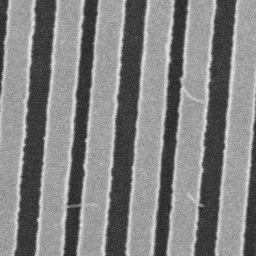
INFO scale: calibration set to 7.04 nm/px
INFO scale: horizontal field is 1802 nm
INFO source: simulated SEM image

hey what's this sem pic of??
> lines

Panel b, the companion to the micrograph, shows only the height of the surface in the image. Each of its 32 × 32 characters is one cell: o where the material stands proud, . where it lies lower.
.ooo...ooo..oooo..oooo..ooo...oo
.ooo...ooo..oooo..oooo..ooo..ooo
.ooo...ooo..oooo..oooo.oooo..ooo
.ooo...ooo..ooo...ooo..oooo..ooo
.ooo...ooo..ooo...ooo..oooo..ooo
.ooo...ooo..ooo...ooo..ooo...ooo
.ooo...ooo..ooo...ooo..ooo...ooo
.ooo...ooo..ooo...ooo..ooo...ooo
oooo...ooo..ooo...ooo..ooo...ooo
oooo..oooo..ooo...ooo..ooo...ooo
oooo..oooo.oooo...ooo..ooo...ooo
oooo..oooo.oooo..oooo..ooo...ooo
ooo...ooo..oooo..oooo..ooo...ooo
ooo...ooo..oooo..oooo.oooo..oooo
ooo...ooo..ooo...oooo.oooo..oooo
ooo...ooo..ooo...oooo.oooo..oooo
ooo...ooo..ooo...ooo..oooo..oooo
ooo...ooo..ooo...ooo..ooo...oooo
ooo...ooo..ooo...ooo..ooo...ooo.
ooo..oooo..ooo...ooo..ooo...ooo.
ooo..oooo..ooo...ooo..ooo...ooo.
ooo..oooo..ooo...ooo..ooo...ooo.
ooo..oooo.oooo...ooo..ooo...ooo.
oo...ooo..oooo..oooo..ooo...ooo.
oo...ooo..oooo..oooo..ooo...ooo.
oo...ooo..oooo..oooo.oooo..oooo.
oo...ooo..ooo...oooo.oooo..oooo.
oo...ooo..ooo...ooo..oooo..oooo.
oo...ooo..ooo...ooo..oooo..oooo.
oo...ooo..ooo...ooo..ooo...ooo..
oo...ooo..ooo...ooo..ooo...ooo..
oo..oooo..ooo...ooo..ooo...ooo..